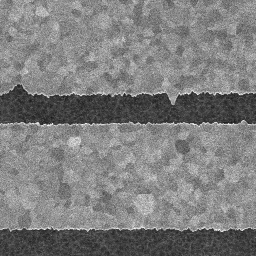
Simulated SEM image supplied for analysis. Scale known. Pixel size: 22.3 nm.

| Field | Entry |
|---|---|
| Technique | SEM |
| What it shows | one or a few lines or trenches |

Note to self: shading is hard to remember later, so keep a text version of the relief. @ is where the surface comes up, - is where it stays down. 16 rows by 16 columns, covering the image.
@@@@@@@@@@@@@@@@
@@@@@@@@@@@@@@@@
@@@@@@@@@@@@@@@@
@@@@@@@@@@@@@@@@
@@@@@@@@@@@@@@@@
@@@@@@@@@@@@@@@@
----------------
----------------
@@@@@@@@@@@@@@@@
@@@@@@@@@@@@@@@@
@@@@@@@@@@@@@@@@
@@@@@@@@@@@@@@@@
@@@@@@@@@@@@@@@@
@@@@@@@@@@@@@@@@
----------------
----------------